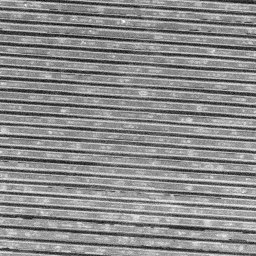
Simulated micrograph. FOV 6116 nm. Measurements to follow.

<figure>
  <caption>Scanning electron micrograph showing parallel lines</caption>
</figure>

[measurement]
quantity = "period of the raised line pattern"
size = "273 nanometers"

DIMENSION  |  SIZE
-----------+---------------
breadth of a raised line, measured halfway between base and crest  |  158 nanometres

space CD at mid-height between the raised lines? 113 nm